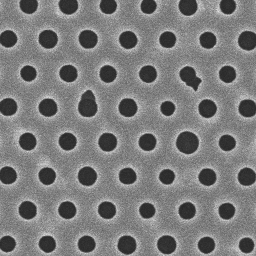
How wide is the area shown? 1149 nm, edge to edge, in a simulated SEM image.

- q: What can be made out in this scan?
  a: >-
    a regular array of holes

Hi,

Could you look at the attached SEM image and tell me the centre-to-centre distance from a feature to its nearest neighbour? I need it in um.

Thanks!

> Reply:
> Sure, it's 0.176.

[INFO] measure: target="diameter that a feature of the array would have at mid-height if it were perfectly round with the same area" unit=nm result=80.5